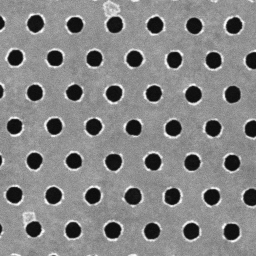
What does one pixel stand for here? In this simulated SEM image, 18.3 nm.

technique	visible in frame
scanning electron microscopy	a regular array of holes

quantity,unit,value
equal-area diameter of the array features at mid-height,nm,306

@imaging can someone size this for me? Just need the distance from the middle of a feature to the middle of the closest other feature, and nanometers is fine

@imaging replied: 716